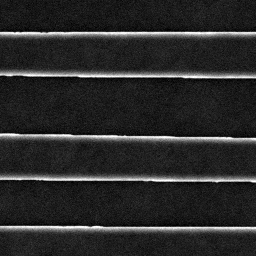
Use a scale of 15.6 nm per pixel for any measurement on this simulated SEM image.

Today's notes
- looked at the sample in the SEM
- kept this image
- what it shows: lines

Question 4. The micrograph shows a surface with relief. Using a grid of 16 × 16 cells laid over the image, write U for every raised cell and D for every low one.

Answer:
DDDDDDDDDDDDDDDD
DDDDDDDDDDDDDDDD
UUUUUUUUUUUUUUUU
UUUUUUUUUUUUUUUU
UUUUUUUUUUUUUUUU
DDDDDDDDDDDDDDDD
DDDDDDDDDDDDDDDD
DDDDDDDDDDDDDDDD
UUUUUDDDDDDDDDDD
UUUUUUUUUUUUUUUU
UUUUUUUUUUUUUUUU
DDDDDDDDDDDDDDDD
DDDDDDDDDDDDDDDD
DDDDDDDDDDDDDDDD
UUUUUUUUUUUUUUUU
UUUUUUUUUUUUUUUU